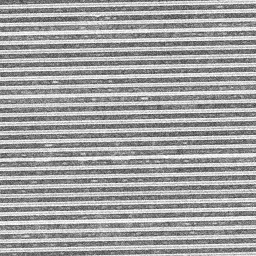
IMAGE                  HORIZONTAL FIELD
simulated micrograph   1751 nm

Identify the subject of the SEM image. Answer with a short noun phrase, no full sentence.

parallel lines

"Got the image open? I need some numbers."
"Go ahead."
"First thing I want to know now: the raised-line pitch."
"61.7 nm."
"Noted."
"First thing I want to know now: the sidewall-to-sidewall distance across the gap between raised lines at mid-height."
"41.9 nm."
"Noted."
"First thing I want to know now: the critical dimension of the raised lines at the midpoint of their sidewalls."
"23.9 nm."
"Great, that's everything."